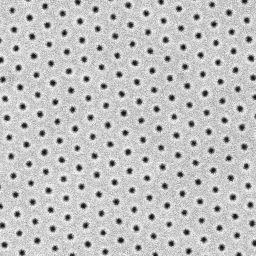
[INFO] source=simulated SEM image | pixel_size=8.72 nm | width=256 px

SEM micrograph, a regular array of holes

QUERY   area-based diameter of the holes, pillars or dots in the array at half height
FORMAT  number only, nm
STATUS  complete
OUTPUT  62.2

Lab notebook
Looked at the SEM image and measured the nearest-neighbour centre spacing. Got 164 nm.